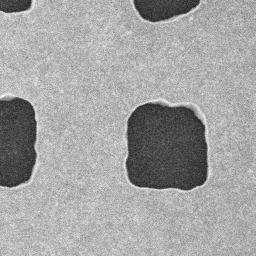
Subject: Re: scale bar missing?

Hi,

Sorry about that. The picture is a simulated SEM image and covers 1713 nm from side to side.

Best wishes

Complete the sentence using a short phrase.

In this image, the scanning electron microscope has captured holes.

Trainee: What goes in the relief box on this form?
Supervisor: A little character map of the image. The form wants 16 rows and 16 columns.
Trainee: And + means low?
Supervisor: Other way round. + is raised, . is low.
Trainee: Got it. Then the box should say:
..++++++....++++
++++++++++++++++
++++++++++++++++
++++++++++++++++
++++++++++++++++
++++++++++++++++
..+++++++.++++++
..++++++.....+++
..++++++.....+++
..++++++.....+++
..++++++.....+++
.+++++++.....+++
++++++++++++++++
++++++++++++++++
++++++++++++++++
++++++++++++++++